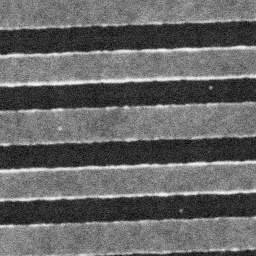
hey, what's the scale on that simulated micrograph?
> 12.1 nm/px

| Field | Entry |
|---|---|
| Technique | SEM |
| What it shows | lines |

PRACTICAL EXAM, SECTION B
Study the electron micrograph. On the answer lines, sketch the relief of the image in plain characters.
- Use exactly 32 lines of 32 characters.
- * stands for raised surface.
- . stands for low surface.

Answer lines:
********************************
********************************
******************************..
***.............................
................................
................................
...............*****************
********************************
********************************
********************************
*****...........................
................................
................................
.............*******************
********************************
********************************
********************************
******************..............
................................
................................
........................********
********************************
********************************
********************************
***************.................
................................
................................
........................********
********************************
********************************
********************************
**********************..........